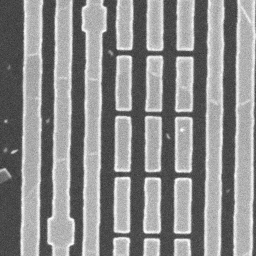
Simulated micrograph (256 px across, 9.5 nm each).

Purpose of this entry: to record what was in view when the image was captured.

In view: wiring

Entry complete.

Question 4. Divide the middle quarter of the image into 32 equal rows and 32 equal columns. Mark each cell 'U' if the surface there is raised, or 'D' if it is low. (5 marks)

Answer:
UUDDDDUUUDDDDUUUUDDDDUUUDDDDUUUU
UUDDDDUUUDDDDUUUUDDDDUUUDDDDUUUU
UDDDDDUUUDDDDUUUUDDDDUUUDDDDUUUU
UUDDDDUUUDDDDUUUUDDDDUUUDDDDUUUU
UUDDDUUUUDDDDUUUUDDDDUUUDDDDUUUU
UUDDDUUUUDDDDUUUUDDDDUUUDDDDUUUU
UDDDDUUUUDDDDUUUUDDDDUUUDDDDUUUU
UDDDDUUUUDDDDUUUUDDDDUUUDDDDUUUU
UDDDDUUUUDDDDUUUUDDDDUUUDDDDUUUU
UDDDDUUUUDDDDUUUUDDDDUUUDDDDUUUU
UUDDDUUUUDDDDUUUUDDDDUUUDDDDUUUU
UDDDDUUUUDDDDUUUDDDDDUUUDDDDUUUU
UDDDDUUUUDDDDDDDDDDDDDDDDDDDDDDD
UDDDDUUUUDDDDUUUDDDDDUUUDDDDUUDD
UDDDDUUUUDDDDUUUUDDDUUUUDDDDUUUU
UDDDDUUUUDDDDUUUUDDDUUUUDDDDUUUU
UDDDDUUUUDDDDUUUUDDDUUUUDDDDUUUU
UDDDDUUUUDDDDUUUUDDDUUUUDDDDUUUU
UDDDDUUUUDDDDUUUUDDDDUUUDDDDUUUU
UDDDDUUUUDDDDUUUUDDDDUUUDDDDUUUU
UDDDDUUUUDDDDUUUUDDDDUUUDDDDUUUU
UDDDDUUUUDDDDUUUUDDDDUUUDDDDUUUU
UDDDDUUUUDDDDUUUUDDDUUUUDDDDUUUU
UDDDDUUUUDDDDUUUUDDDUUUUDDDDUUUU
UDDDDUUUUDDDDUUUUDDDUUUUDDDDUUUU
UDDDDUUUUDDDDUUUDDDDUUUUDDDDUUUU
UDDDDUUUUDDDDUUUDDDDUUUUDDDDUUUU
UDDDDUUUUDDDDDDDDDDDDDDDDDDDDDDD
UDDDDUUUUDDDDDDDDDDDDDDDDDDDDDDD
UDDDDUUUUDDDDUUUDDDDUUUUDDDDUUUU
UDDDDUUUUDDDDUUUDDDDUUUUDDDDUUUU
UDDDDUUUUDDDDUUUDDDDUUUUDDDDUUUU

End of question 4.